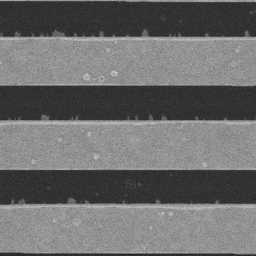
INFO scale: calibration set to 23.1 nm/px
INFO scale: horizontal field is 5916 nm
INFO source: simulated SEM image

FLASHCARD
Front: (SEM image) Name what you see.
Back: lines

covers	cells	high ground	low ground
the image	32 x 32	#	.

................................
................................
................................
................................
................................
################################
################################
################################
################################
################################
################################
................................
................................
................................
................................
################################
################################
################################
################################
################################
################################
................................
................................
................................
................................
................................
################################
################################
################################
################################
################################
....############################